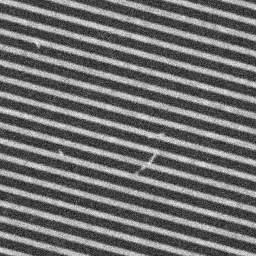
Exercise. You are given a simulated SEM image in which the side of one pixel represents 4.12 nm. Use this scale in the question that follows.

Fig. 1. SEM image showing parallel lines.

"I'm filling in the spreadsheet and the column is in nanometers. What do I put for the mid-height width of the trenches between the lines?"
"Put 48.8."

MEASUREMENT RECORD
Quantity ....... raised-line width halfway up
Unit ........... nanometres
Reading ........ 13.9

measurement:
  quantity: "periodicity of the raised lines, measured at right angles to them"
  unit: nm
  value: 62.1